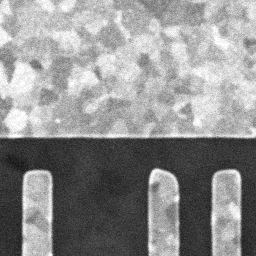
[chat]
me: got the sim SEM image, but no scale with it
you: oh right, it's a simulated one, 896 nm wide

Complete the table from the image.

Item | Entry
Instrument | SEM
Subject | wiring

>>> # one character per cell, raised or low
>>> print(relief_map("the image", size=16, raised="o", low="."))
oooooooooooooooo
oooooooooooooooo
oooooooooooooooo
oooooooooooooooo
oooooooooooooooo
oooooooooooooooo
oooooooooooooooo
oooooooooooooooo
oooooooooooooooo
................
................
..o......oo..oo.
.oo......oo..oo.
.oo......oo..oo.
.oo......oo..oo.
.oo......oo..oo.